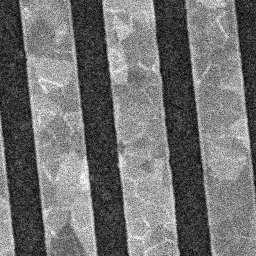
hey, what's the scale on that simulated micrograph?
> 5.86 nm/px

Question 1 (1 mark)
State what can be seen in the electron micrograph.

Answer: one or a few lines or trenches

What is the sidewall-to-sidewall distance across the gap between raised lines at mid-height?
197 nanometres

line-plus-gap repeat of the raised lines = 480 nm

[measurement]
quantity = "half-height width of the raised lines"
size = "277 nm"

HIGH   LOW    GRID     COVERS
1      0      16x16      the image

0111001111001110
0111000111001110
0011100111001110
0011100111001110
0011100111001110
0011100111001110
0011100111001110
0011100111001110
0011100111000110
0011100111000111
0011100011100111
0001110011100111
1001110011100111
1001110011100111
1001110011100111
1001110011100111